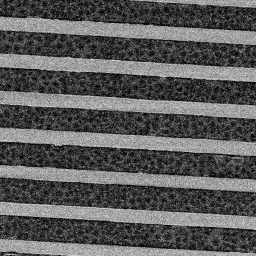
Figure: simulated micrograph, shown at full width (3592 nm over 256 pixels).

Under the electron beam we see parallel lines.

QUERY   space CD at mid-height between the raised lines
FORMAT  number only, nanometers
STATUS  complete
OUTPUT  342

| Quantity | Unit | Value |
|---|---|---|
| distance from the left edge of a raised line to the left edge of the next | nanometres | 519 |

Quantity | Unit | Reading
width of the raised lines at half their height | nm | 172